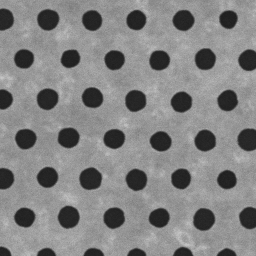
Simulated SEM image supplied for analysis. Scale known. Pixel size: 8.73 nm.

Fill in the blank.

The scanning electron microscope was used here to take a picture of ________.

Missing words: a regular array of holes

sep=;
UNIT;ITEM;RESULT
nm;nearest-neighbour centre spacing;384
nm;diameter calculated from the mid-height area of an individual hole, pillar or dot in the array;184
